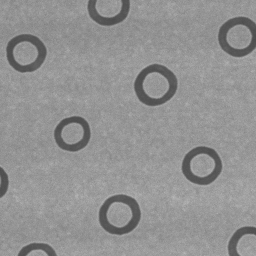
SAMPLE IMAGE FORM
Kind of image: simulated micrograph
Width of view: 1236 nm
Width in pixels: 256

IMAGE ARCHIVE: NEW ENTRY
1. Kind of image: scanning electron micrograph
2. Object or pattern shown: ring-shaped grooves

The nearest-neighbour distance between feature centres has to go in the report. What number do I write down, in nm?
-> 450